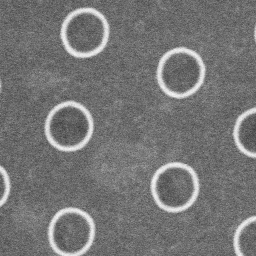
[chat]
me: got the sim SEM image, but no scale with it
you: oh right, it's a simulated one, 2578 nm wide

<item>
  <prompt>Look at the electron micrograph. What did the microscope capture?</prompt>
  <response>raised bodies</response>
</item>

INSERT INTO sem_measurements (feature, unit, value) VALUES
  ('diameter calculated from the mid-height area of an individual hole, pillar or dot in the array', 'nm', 454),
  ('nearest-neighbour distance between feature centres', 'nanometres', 1000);